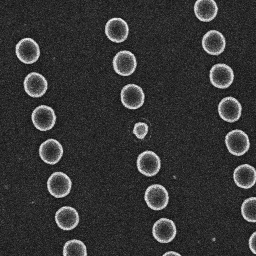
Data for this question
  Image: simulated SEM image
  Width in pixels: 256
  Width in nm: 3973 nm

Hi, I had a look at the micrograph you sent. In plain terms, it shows a regular array of raised bodies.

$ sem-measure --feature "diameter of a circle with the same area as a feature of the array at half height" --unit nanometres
350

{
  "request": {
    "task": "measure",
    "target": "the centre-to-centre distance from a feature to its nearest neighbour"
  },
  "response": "34.1 px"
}